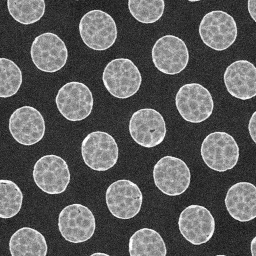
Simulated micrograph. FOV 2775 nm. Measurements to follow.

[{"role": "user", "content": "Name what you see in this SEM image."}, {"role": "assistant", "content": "a regular array of raised bodies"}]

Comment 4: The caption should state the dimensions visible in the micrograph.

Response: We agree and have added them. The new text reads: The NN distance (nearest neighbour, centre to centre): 581 nm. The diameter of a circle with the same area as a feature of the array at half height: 0.402 microns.